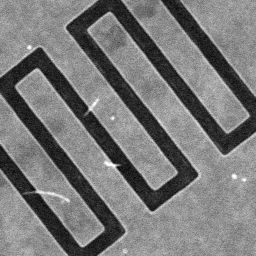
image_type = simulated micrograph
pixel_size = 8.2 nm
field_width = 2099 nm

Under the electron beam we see groups of lines, slits or small figures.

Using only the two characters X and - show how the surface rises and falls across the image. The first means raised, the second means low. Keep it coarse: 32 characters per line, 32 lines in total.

XXXXXXXXXXXX----XXXX---XXXXXXXXX
XXXXXXXXXX------XXXXX---XXXXXXXX
XXXXXXXXX---XXX--XXXXX--XXXXXXXX
XXXXXXXX---XXXX---XXXXX--XXXXXXX
XXXXXXXXX--XXXXX---XXXX---XXXXXX
XXXXXXXXXX--XXXXX---XXXX---XXXXX
XXXX--XXXX---XXXXX--XXXXX---XXXX
XXX---XXXXX---XXXXX--XXXXX--XXXX
X------XXXXX---XXXX---XXXXX--XXX
---XXX--XXXXX--XXXXX---XXXX---XX
--XXXX---XXXXX--XXXXX--XXXXX---X
--XXXXX---XXXX---XXXXX--XXXXX--X
X--XXXXX--XXXXX---XXXX---XXXXX--
X---XXXXX--XXXXX--XXXXX---XXXXX-
XX---XXXX---XXXXX--XXXXX---XXXX-
XXX--XXXXX---XXXXX--XXXXX--XXX--
XXXX--XXXXX---XXXX---XXXXX--X---
XXXX---XXXXX--XXXXX---XXXX-----X
XXXXX---XXXXX--XXXXX--XXXXX--XXX
-XXXXX---XXXX---XXXXX--XXXXXXXXX
--XXXXX--XXXXX---XXXX---XXXXXXXX
---XXXXX--XXXXX--XXXXX---XXXXXXX
X---XXXX---XXXXX--XXX---XXXXXXXX
XX--XXXXX---XXXX---X---XXXXXXXXX
XXX--XXXXX--XXXXX-----XXXXXXXXXX
XXX---XXXXX--XXXXX--XXXXXXXXXXXX
XXXX---XXXXX--XXXXXXXXXXXXXXXXXX
XXXXX---XXXX---XXXXXXXXXXXXXXXXX
XXXXXX--XXXXX--XXXXXXXXXXXXXXXXX
XXXXXXX--XXX---XXXXXXXXXXXXXXXXX
XXXXXXX---X---XXXXXXXXXXXXXXXXXX
XXXXXXXX-----XXXXXXXXXXXXXXXXXXX